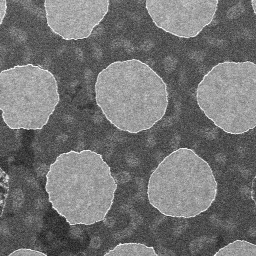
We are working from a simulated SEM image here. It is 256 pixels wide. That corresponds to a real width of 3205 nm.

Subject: raised bodies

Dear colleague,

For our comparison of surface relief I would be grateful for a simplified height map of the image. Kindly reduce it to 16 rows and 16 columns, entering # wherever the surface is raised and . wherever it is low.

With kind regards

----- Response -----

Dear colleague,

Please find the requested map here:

...####..####...
...###....###...
................
................
###...####...###
####..####..####
####..####..####
###....###...###
................
.....#.....#....
...####...###...
...####..####...
...####..####...
....###....#....
................
.......##.....##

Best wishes